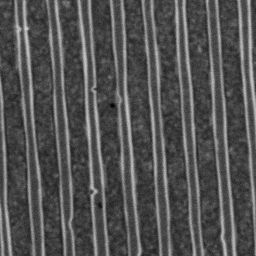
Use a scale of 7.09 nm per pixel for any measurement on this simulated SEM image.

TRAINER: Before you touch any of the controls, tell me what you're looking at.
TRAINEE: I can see parallel lines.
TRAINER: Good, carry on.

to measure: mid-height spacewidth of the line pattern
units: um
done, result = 0.154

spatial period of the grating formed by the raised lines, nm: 225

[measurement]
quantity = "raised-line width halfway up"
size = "69.8 nm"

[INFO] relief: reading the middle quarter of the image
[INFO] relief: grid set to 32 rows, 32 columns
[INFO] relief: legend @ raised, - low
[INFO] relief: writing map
-----@@------@@------@@------@@-
-----@@------@@------@@@-----@@-
-----@@@-----@@------@@@-----@@-
------@@-----@@------@@@-----@@@
------@@-----@@------@@@-----@@@
-----@@@-----@@-------@@-----@@@
------@------@@------@@@-----@@@
------@@------@------@@@-----@@@
------@@------@-------@@-----@@@
------@@------@@------@@-----@@@
------@@------@@------@@------@@
------@@------@@------@@------@@
------@@------@@------@@------@@
------@@------@@------@@------@@
------@@------@@------@@------@@
@-----@@------@@------@@------@@
@-----@@------@@-------@------@@
@-----@@------@@@-----@@------@@
@-----@@------@@@-----@@@-----@@
@-----@@@-----@@@-----@@@-----@@
@-----@@@-----@@@------@@-----@@
@-----@@@------@@------@@-----@@
@-----@@@------@@------@@-----@@
@------@@------@@------@@------@
@------@@-----@@@------@@------@
@------@@------@@------@@------@
@------@@------@@------@@------@
@@-----@@@-----@@------@@------@
@@-----@@@-----@@------@@------@
@@-----@@@-----@@------@@------@
@@-----@@@-----@@------@@@-----@
@@-----@@@-----@@------@@@-----@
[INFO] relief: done